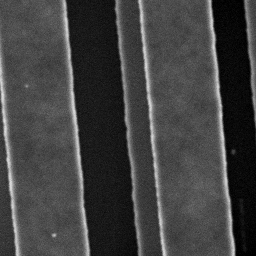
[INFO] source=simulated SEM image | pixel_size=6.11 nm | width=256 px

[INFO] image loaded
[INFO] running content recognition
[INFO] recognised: lines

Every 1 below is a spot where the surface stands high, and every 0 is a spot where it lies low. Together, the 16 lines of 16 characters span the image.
1111000111111001
1111000111111001
1111000111111000
1111000011111100
1111000011111100
1111100011111100
1111100011111100
1111100011111100
1111100011111100
1111100011111100
1111100011111100
1111100011111100
1111100011111100
1111100011111100
1111100001111110
1111110001111110